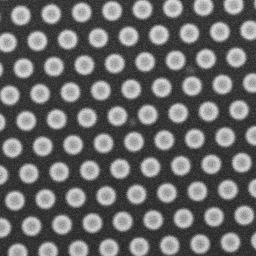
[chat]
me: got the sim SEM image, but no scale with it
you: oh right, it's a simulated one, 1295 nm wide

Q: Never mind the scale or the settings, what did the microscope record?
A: an array of small figures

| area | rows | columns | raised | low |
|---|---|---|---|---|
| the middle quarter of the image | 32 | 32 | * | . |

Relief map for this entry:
...****...*****...****....****..
...****....***.....**...........
.....*..........................
...............................*
...............***.....***....**
***....****....****...*****...**
****...****....****...*****...**
****...****....****....***.....*
***.....***.....................
................................
....................**.....***..
.....**.....***....****...*****.
....****...*****...****...*****.
....****...*****...****....***..
....****....***.....**......*...
.....**.........................
................................
................***....****....*
.***....****...*****...****...**
****....****...*****...****....*
****....****...*****...****....*
****....***.....**..............
................................
............................**..
......*.....****....****...****.
*...****....****...*****...****.
*...*****...****...*****...****.
*...*****...****....***.....**..
.....***........................
................................
.................**.....***.....
..**.....***....****....****...*